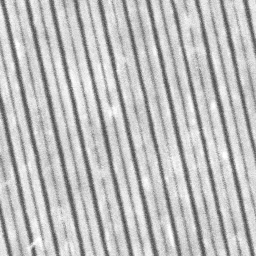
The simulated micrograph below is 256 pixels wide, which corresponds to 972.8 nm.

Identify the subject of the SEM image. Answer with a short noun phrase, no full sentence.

parallel lines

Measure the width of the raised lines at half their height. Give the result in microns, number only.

0.0316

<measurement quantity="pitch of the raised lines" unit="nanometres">45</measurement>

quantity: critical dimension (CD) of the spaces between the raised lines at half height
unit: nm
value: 17.7